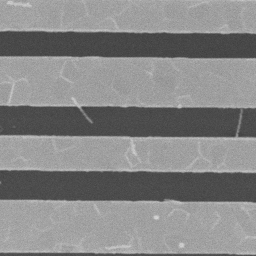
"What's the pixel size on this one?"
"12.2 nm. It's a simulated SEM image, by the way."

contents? lines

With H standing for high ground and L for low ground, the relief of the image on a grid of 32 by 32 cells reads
HHHHHHHHHHHHHHHHHHHHHHHHHHHHHHHH
HHHHHHHHHHHHHHHHHHHHHHHHHHHHHHHH
HHHHHHHHHHHHHHHHHHHHHHHHHHHHHHHH
HHHHHHHHHHHHHHHHHHHHHHHHHHHHHHHH
LLLLLLLLLLLLLLLLLLLLLLLLLLLLLLLL
LLLLLLLLLLLLLLLLLLLLLLLLLLLLLLLL
LLLLLLLLLLLLLLLLLLLLLLLLLLLLLLLL
HHHHHHHHHHHHHHHHHHHHHHHHHHHHHHHH
HHHHHHHHHHHHHHHHHHHHHHHHHHHHHHHH
HHHHHHHHHHHHHHHHHHHHHHHHHHHHHHHH
HHHHHHHHHHHHHHHHHHHHHHHHHHHHHHHH
HHHHHHHHHHHHHHHHHHHHHHHHHHHHHHHH
HHHHHHHHHHHHHHHHHHHHHHHHHHHHHHHH
LLLLLLLLLLLLLLLLLLLLLLLLLLLLLLLL
LLLLLLLLLLLLLLLLLLLLLLLLLLLLLLLL
LLLLLLLLLLLLLLLLLLLLLLLLLLLLLLLL
LLLLLLLLLLLLLLLLLLLLLLLLLLLLLLLL
HHHHHHHHHHHHHHHHHHHHHHHHHHHHHHHH
HHHHHHHHHHHHHHHHHHHHHHHHHHHHHHHH
HHHHHHHHHHHHHHHHHHHHHHHHHHHHHHHH
HHHHHHHHHHHHHHHHHHHHHHHHHHHHHHHH
LLLLLLLLLLLLLLLLLLLLLLLLLLLLLLHH
LLLLLLLLLLLLLLLLLLLLLLLLLLLLLLLL
LLLLLLLLLLLLLLLLLLLLLLLLLLLLLLLL
LLLLLLLLLLLLLLLLLLLLLLLLLLLLLLLL
HHHHHHHHHHHHHHHHHHHHHHHHHHHHHHHH
HHHHHHHHHHHHHHHHHHHHHHHHHHHHHHHH
HHHHHHHHHHHHHHHHHHHHHHHHHHHHHHHH
HHHHHHHHHHHHHHHHHHHHHHHHHHHHHHHH
HHHHHHHHHHHHHHHHHHHHHHHHHHHHHHHH
HHHHHHHHHHHHHHHHHHHHHHHHHHHHHHHH
HHHHHHHHHHHHHHHHHHHHHHHHHHHHHHHH